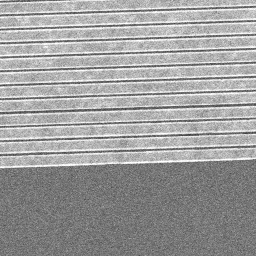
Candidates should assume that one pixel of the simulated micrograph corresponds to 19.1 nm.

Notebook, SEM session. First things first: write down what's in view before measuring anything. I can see parallel lines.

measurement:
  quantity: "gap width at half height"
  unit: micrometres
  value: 0.0739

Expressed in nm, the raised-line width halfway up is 202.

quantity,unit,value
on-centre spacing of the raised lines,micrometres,0.266